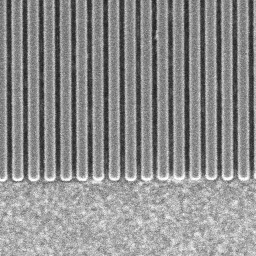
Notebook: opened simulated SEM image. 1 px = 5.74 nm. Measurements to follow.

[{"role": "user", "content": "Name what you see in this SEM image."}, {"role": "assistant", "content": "parallel lines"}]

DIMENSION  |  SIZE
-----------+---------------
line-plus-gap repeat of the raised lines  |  0.0927 microns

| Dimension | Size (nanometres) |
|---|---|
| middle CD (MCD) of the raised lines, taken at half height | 60.3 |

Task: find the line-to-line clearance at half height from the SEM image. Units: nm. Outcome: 30.1